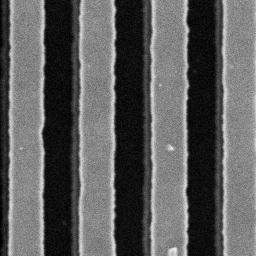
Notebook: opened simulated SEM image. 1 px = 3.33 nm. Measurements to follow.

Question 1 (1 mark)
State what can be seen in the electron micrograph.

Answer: lines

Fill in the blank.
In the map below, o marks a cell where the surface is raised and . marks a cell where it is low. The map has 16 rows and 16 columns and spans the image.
.oo..oo..ooo..oo
.oo..oo...oo..oo
.oo..oo..ooo..oo
.oo..oo..ooo..oo
.oo..oo..ooo..oo
.oo..oo..ooo..oo
.oo..oo..ooo..oo
.oo..oo..ooo..oo
.oo..oo..ooo..oo
.oo..oo..ooo..oo
.oo..oo...oo..oo
.oo..oo..ooo..oo
.oo..oo..ooo..oo
.oo..oo..ooo..oo
.oo..oo..ooo..oo
ooo..oo..ooo..oo